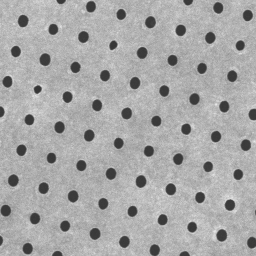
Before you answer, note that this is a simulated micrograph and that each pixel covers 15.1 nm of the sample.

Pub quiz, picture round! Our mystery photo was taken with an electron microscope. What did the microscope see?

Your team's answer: a regular array of holes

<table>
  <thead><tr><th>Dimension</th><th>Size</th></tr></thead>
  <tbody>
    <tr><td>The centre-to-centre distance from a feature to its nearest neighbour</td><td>462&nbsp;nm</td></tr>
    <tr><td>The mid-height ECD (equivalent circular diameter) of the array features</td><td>0.165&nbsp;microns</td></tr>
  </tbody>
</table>